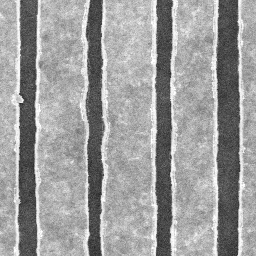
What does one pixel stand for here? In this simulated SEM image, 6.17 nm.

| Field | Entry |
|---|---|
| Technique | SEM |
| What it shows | one or a few lines or trenches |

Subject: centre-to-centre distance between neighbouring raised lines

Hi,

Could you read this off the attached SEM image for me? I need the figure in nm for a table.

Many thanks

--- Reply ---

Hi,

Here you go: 409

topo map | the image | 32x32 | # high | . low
##...######..######...#####...##
##...######..######...#####...##
##...######..######...#####...##
##...######..######...#####...##
##...######..######...#####...##
##...######..######...#####...##
##...######..######...#####...##
##...######..######...#####...##
##...######..######...#####...##
##...######..######...#####...##
##...######..######..######...##
##...######..######...#####...##
###..######..######...#####...##
##...######..######...#####...##
##...######..######...#####...##
##...######..######...#####...##
##...######..######...#####...##
##...######..######...#####...##
##...######..######...#####...##
##...######..######...#####...##
##...######..######...#####...##
##...######..######..######...##
##...######..######...#####...##
##...######..######...#####...##
##...######..######...#####...##
##...######..######...#####...##
##...######..######...#####...##
##...######..######...#####...##
##...######..######...#####...##
##...######..######...#####...##
##...######..######...#####...##
##...######..######...#####...##